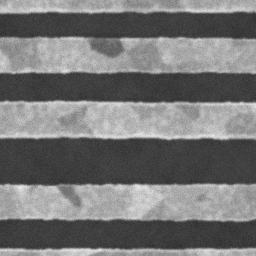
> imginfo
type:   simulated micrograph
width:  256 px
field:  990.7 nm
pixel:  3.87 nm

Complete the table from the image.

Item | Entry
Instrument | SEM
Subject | lines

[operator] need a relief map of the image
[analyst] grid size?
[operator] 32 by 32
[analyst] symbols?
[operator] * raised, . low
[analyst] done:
********************************
................................
................................
................................
................................
********************************
********************************
********************************
********************************
................................
................................
................................
................................
********************************
********************************
********************************
********************************
................................
................................
................................
................................
................................
................................
********************************
********************************
********************************
********************************
......................*....****.
................................
................................
................................
********************************